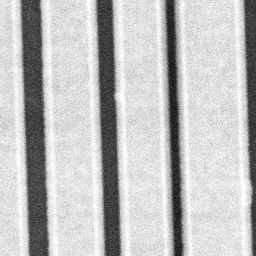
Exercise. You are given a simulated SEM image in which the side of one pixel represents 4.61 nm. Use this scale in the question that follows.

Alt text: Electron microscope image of one or a few lines or trenches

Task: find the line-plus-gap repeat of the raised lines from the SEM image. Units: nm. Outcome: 325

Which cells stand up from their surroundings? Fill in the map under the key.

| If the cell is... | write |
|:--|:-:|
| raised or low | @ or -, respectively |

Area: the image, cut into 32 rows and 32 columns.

@@----@@@@@----@@@@@--@@@@@@@@--
@@----@@@@@----@@@@@--@@@@@@@@--
@@----@@@@@@---@@@@@--@@@@@@@@--
@@----@@@@@@---@@@@@---@@@@@@@--
@@----@@@@@@---@@@@@---@@@@@@@--
@@----@@@@@@---@@@@@---@@@@@@@--
@@----@@@@@@---@@@@@---@@@@@@@--
@@----@@@@@@---@@@@@---@@@@@@@--
@@----@@@@@@---@@@@@---@@@@@@@--
@@----@@@@@@---@@@@@---@@@@@@@--
@@----@@@@@@---@@@@@---@@@@@@@--
@@----@@@@@@---@@@@@---@@@@@@@--
@@----@@@@@@---@@@@@---@@@@@@@--
@@----@@@@@@---@@@@@@--@@@@@@@--
@@----@@@@@@---@@@@@@--@@@@@@@--
@@----@@@@@@---@@@@@@--@@@@@@@--
@@@---@@@@@@---@@@@@@--@@@@@@@--
@@@---@@@@@@---@@@@@@--@@@@@@@--
@@@---@@@@@@---@@@@@@--@@@@@@@--
@@@---@@@@@@---@@@@@@--@@@@@@@@-
@@@---@@@@@@---@@@@@@--@@@@@@@@-
@@@---@@@@@@---@@@@@@--@@@@@@@@-
@@@---@@@@@@---@@@@@@--@@@@@@@@-
@@@---@@@@@@---@@@@@@--@@@@@@@@-
@@@---@@@@@@----@@@@@--@@@@@@@@-
@@@---@@@@@@----@@@@@--@@@@@@@@-
@@@---@@@@@@---@@@@@@--@@@@@@@@-
@@@----@@@@@----@@@@@--@@@@@@@@-
@@@----@@@@@----@@@@@--@@@@@@@@-
@@@----@@@@@----@@@@@--@@@@@@@@-
@@@----@@@@@----@@@@@--@@@@@@@@-
@@@----@@@@@----@@@@@--@@@@@@@@-